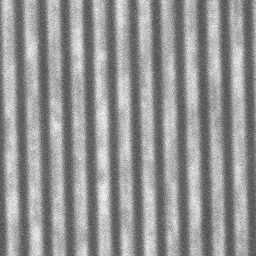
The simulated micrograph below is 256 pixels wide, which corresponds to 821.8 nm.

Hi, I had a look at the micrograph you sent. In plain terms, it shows parallel lines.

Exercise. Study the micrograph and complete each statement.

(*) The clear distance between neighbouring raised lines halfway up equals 43.4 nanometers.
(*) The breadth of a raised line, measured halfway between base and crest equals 0.0289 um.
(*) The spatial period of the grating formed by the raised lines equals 73.4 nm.